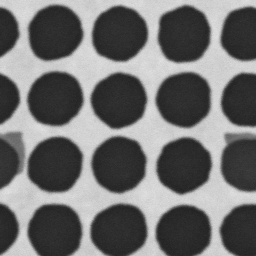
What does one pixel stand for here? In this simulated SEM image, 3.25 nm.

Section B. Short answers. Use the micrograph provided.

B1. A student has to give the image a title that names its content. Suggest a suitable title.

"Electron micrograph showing a regular array of holes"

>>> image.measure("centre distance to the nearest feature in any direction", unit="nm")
209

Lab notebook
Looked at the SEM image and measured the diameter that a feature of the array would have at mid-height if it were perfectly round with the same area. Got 181 nanometers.